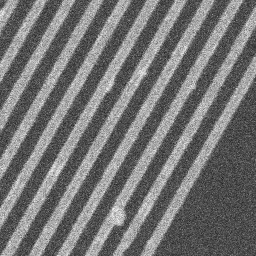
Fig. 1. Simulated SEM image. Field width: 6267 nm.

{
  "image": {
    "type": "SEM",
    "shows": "parallel lines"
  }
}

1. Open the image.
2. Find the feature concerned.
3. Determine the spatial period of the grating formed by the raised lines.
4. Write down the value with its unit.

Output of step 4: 593 nm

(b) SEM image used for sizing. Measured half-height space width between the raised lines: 0.385 µm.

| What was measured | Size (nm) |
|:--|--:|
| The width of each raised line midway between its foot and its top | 210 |